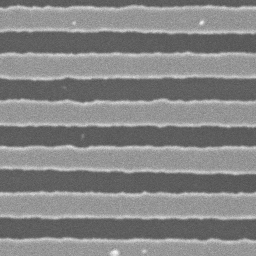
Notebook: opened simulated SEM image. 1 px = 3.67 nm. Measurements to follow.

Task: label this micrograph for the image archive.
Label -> lines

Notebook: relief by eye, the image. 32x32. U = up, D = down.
DDDDDDDDDDDDDDDDDDDDDDDDDDDDDDDD
UUUUUUUUUUUUUUUUUUUUUUUUUUUUUUUU
UUUUUUUUUUUUUUUUUUUUUUUUUUUUUUUU
UUUUUUUUUUUUUUUUUUUUUUUUUUUUUUUU
DDDDDDDDDDDDDDDDDDDDDDDDDDDDDDDD
DDDDDDDDDDDDDDDDDDDDDDDDDDDDDDDD
DDDDDDDDDDDDDDDDDDDDDDDDDDDDDDDD
UUUUUUUUUUUUUUUUUUUUUUUUUUUUUUUU
UUUUUUUUUUUUUUUUUUUUUUUUUUUUUUUU
UUUUUUUUUUUUUUUUUUUUUUUUUUUUUUUU
DDDDDDDDDDDDDDDDDDDDDDDDDDDDDDDD
DDDDDDDDDDDDDDDDDDDDDDDDDDDDDDDD
DUUDDDDDDDDDDDDDDDDDUDDDDDDDDDDD
UUUUUUUUUUUUUUUUUUUUUUUUUUUUUUUU
UUUUUUUUUUUUUUUUUUUUUUUUUUUUUUUU
UUUUUUUUUUUUUUUUUUUUUUUUUUUUUUUU
DDDDDDDDDDDDDDDDDDDDDDDDDDDDDDDD
DDDDDDDDDDDDDDDDDDDDDDDDDDDDDDDD
UUUUUUUUUUUUUUUUUUUUUUUUUUUUUUUU
UUUUUUUUUUUUUUUUUUUUUUUUUUUUUUUU
UUUUUUUUUUUUUUUUUUUUUUUUUUUUUUUU
DDDDDDDDDDDDDDDDUDDUUUUUUUUUUUUU
DDDDDDDDDDDDDDDDDDDDDDDDDDDDDDDD
DDDDDDDDDDDDDDDDDDDDDDDDDDDDDDDD
UUUUUUUUUUUUUUUUUUUUUUUUUUUUUUUU
UUUUUUUUUUUUUUUUUUUUUUUUUUUUUUUU
UUUUUUUUUUUUUUUUUUUUUUUUUUUUUUUU
DDDDDDDDDDDDDDDDDDDDDDDDDDDDDDDD
DDDDDDDDDDDDDDDDDDDDDDDDDDDDDDDD
DDDDDDDDDDDDDDDDDDDDDDDDDDDDDDDD
UUUUUUUUUUUUUUUUUUUUUUUUUUUUUUUU
UUUUUUUUUUUUUUUUUUUUUUUUUUUUUUUU